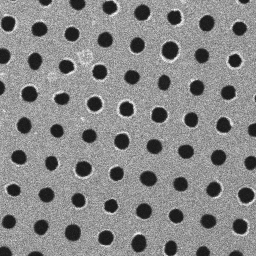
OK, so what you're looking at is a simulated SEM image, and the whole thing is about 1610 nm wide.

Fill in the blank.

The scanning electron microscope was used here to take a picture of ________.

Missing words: a regular array of holes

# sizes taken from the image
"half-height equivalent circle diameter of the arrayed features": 0.0917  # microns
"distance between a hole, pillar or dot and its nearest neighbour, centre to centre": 203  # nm